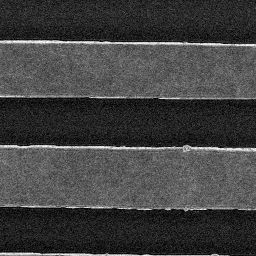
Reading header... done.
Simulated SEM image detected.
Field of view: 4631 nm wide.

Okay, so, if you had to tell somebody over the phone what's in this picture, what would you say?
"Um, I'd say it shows lines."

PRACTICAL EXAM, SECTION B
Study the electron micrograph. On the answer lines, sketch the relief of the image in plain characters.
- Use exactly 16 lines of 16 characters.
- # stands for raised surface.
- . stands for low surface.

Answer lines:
................
................
................
################
################
################
................
................
................
################
################
################
################
................
................
................